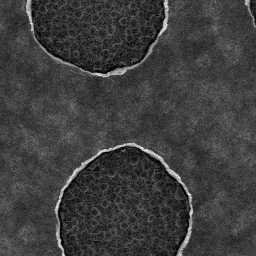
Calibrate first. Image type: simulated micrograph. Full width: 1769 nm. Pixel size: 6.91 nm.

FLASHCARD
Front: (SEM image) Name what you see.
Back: holes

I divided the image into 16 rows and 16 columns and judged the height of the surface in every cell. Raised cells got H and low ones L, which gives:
HHLLLLLLLLHHHHHH
HHLLLLLLLLHHHHHH
HHLLLLLLLLHHHHHH
HHHLLLLLLHHHHHHH
HHHHHHLHHHHHHHHH
HHHHHHHHHHHHHHHH
HHHHHHHHHHHHHHHH
HHHHHHHHHHHHHHHH
HHHHHHHHHHHHHHHH
HHHHHHHLLHHHHHHH
HHHHHLLLLLHHHHHH
HHHHLLLLLLLHHHHH
HHHHLLLLLLLLHHHH
HHHHLLLLLLLLHHHH
HHHHLLLLLLLLHHHH
HHHHLLLLLLLHHHHH